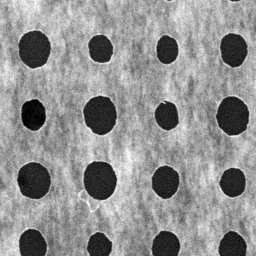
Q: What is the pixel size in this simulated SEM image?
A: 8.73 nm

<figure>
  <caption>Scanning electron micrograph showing a regular array of holes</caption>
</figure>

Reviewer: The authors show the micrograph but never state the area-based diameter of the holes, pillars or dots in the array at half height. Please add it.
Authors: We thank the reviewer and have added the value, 272 nm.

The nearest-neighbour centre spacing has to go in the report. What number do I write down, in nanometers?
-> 576